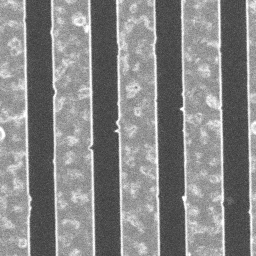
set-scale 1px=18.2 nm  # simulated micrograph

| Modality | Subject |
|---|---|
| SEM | one or a few lines or trenches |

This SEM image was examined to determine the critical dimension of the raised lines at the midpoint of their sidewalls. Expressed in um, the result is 0.682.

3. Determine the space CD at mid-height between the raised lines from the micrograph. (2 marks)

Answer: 495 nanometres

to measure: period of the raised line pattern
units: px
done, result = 64.3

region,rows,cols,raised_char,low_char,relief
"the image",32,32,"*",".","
***....****....****....****....*
***....****....****....****....*
***....****....****....****....*
***....****....****....****....*
***....****....****....****....*
***....****....****....****....*
***....****....****....****....*
***....****....****....*****...*
***....****....****....*****...*
***....****....****....*****...*
***....****....****....*****...*
***....****....****....*****...*
***....****....****....*****...*
***....****....*****...*****...*
***....****....*****...*****...*
***....****....*****...*****...*
***....****....*****...*****...*
***....****....*****...*****...*
***....****....*****...*****...*
***....*****...*****...*****...*
***....*****...*****...*****...*
***....*****...*****...*****...*
***....*****...*****...*****...*
***....*****...*****...*****...*
****...*****...*****...*****...*
****...*****...*****...*****...*
****...*****...*****...*****...*
****...*****...*****...*****...*
****...*****...*****...*****...*
****...*****...*****...*****...*
****...*****...*****...*****...*
****...*****...*****...*****...*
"